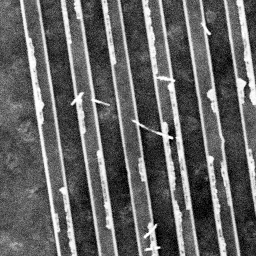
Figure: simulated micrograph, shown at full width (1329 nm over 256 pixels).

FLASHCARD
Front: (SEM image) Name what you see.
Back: parallel lines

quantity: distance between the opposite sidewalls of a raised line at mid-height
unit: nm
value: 87.2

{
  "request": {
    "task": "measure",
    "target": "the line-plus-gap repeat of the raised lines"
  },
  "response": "209 nanometers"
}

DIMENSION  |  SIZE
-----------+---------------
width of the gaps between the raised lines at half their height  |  23.2 pixels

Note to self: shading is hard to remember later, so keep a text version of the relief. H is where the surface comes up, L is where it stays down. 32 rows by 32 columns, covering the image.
LLLHHLLLHHLLLHHLLLHHLLLHHLLLHHLL
LLLHHLLLHHLLLHHLLLHHLLLHHLLLHHLL
LLLHHLLLHHLLLHHLLLHHLLLHHLLLLHHL
LLLHHLLLHHLLLHHLLLHHHLLHHHLLLHHL
LLLHHLLLHHHLLLHHLLLHHLLLHHLLLHHL
LLLLHHLLLHHLLLHHLLLHHLLLHHLLLHHL
LLLLHHLLLHHLLLHHLLLHHLLLHHLLLHHL
LLLLHHLLLHHLLLHHLLLHHLLLHHLLLHHL
LLLLHHLLLHHLLLHHLLLHHLLLHHLLLHHH
LLLLHHLLLHHLLLHHLLLHHLLLHHLLLLHH
LLLLHHLLLHHLLLHHHLLHHHLLLHHLLLHH
LLLLHHHLLHHHLLLHHLLLHHLLLHHLLLHH
LLLLHHHLLHHHLLLHHLLLHHLLLHHLLLHH
LLLLLHHLLLHHLLLHHLLLHHLLLHHLLLHH
LLLLLHHLLLHHLLLHHLLLHHLLLHHLLLHH
LLLLLHHLLLHHLLLHHLLLHHLLLHHLLLHH
LLLLLHHLLLHHLLLHHLLLHHLLLLHHLLLH
LLLLLHHLLLHHLLLHHHLLLHHLLLHHLLLH
LLLLLHHLLLLHHLLHHHLLLHHLLLHHLLLH
LLLLLLHHLLLHHLLLHHLLLHHLLLHHLLLH
LLLLLLHHLLLHHLLLHHLLLHHLLLHHLLLH
LLLLLLHHLLLHHLLLHHLLLHHLLLHHLLLH
LLLLLLHHLLLHHLLLHHLLLHHLLLHHLLLH
LLLLLLHHLLLHHLLLHHLLLHHHLLHHHLLL
LLLLLLHHLLLHHHLLHHHLLLHHLLLHHLLL
LLLLLLHHHLLLHHLLLHHLLLHHLLLHHLLL
LLLLLLLHHLLLHHLLLHHLLLHHLLLHHLLL
LLLLLLLHHLLLHHLLLHHLLLHHLLLHHLLL
LLLLLLLHHLLLHHLLLHHLLLHHLLLHHLLL
LLLLLLLHHLLLHHLLLHHLLLHHLLLHHHLL
LLLLLLLHHLLLHHLLLHHHLLHHHLLHHHLL
LLLLLLLHHLLLHHLLLLHHLLLHHLLLHHLL